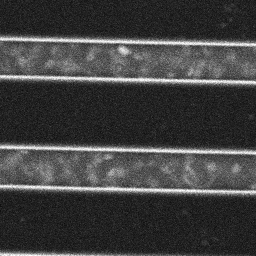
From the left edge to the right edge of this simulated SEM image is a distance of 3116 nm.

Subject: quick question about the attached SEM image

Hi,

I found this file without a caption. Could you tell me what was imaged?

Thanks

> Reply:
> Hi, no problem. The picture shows one or a few lines or trenches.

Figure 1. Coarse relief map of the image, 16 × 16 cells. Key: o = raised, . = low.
oooooooooooooooo
oooooooooooooooo
.ooooooooooooooo
................
................
oooooooooooooooo
oooooooooooooooo
oooooooooooooooo
oooooooooooooooo
............oooo
................
................
oooooooooooooooo
oooooooooooooooo
oooooooooooooooo
oooooooooooooooo